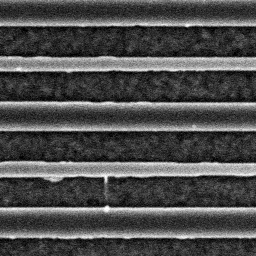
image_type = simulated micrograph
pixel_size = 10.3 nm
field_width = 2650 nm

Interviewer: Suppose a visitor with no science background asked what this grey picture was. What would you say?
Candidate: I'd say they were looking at lines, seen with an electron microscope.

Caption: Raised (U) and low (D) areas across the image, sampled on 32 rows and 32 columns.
UUUUUUUUUUUUUUUUUUUUUUUUUUUUUUUU
UUUUUUUUUUUUUUUUUUUUUUUUUUUUUUUU
UUUUUUUUUUUUUUUUUUUUUUUUUUUUUUUU
DDDDDDDDDDDDDDDDDDDDDDDDDDDDDDDD
DDDDDDDDDDDDDDDDDDDDDDDDDDDDDDDD
DDDDDDDDDDDDDDDDDDDDDDDDDDDDDDDD
DDDDDDDDDDDDDDDDDDDDDDDDDDDDDDDD
UUUUUUUUUUUUUUUUUUUUUUUUUUUUUUUU
UUUUUUUUUUUUUUUUUUUUUUUUUUUUUUUU
DDDDDDDDDDDDDDDDDDDDDDDDDDDDDDDD
DDDDDDDDDDDDDDDDDDDDDDDDDDDDDDDD
DDDDDDDDDDDDDDDDDDDDDDDDDDDDDDDD
DDDDDDDDDDDDDDDDDDDDDDDDDDDDDDDD
UUUUUUUUUUUUUUUUUUUUUUUUUUUUUUUU
UUUUUUUUUUUUUUUUUUUUUUUUUUUUUUUU
UUUUUUUUUUUUUUUUUUUUUUUUUUUUUUUU
DDDDDDDDDDDDDDDDDDDDDDDDDDDDDDDD
DDDDDDDDDDDDDDDDDDDDDDDDDDDDDDDD
DDDDDDDDDDDDDDDDDDDDDDDDDDDDDDDD
DDDDDDDDDDDDDDDDDDDDDDDDDDDDDDDD
UUUUUUUUUUUUUUUUUUUUUUUUUUUUUUUU
UUUUUUUUUUUUUUUUUUUUUUUUUUUUUUUU
DDDDDDDDDDDDDDDDDDDDDDDDDDDDDDDD
DDDDDDDDDDDDDDDDDDDDDDDDDDDDDDDD
DDDDDDDDDDDDDDDDDDDDDDDDDDDDDDDD
DDDDDDDDDDDDDDDDDDDDDDDDDDDDDDDD
UUUUUUUUUUUUUUUUUUUUUUUUUUUUUUUU
UUUUUUUUUUUUUUUUUUUUUUUUUUUUUUUU
UUUUUUUUUUUUUUUUUUUUUUUUUUUUUUUU
UUUUUUUUUUUUUUUUUUUUUUUUUUUUUUUU
DDDDDDDDDDDDDDDDDDDDDDDDDDDDDDDD
DDDDDDDDDDDDDDDDDDDDDDDDDDDDDDDD